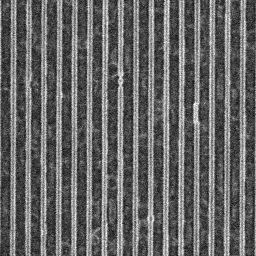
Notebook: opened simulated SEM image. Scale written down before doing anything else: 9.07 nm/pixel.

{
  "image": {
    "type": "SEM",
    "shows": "parallel lines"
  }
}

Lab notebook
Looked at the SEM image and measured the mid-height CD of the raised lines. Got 35.1 nanometers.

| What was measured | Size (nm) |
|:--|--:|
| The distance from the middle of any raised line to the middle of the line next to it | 139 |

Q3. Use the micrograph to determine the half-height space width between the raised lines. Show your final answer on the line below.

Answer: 0.105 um